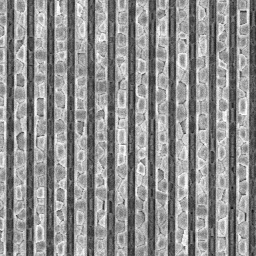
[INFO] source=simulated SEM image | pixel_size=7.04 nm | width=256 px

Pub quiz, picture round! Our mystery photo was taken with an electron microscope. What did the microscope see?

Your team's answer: parallel lines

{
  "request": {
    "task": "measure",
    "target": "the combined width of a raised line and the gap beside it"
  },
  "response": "142 nm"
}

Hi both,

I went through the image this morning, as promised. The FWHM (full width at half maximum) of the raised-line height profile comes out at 88.9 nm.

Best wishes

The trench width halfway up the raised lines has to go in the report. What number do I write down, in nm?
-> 53.7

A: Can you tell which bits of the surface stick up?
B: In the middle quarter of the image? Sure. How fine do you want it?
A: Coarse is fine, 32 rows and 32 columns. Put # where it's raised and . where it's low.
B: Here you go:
#..###..###..###..###..###..###.
#..###..###..###..###..###..###.
#..###..###..###..###..###..###.
#..###..###..###..###..###..###.
#..###..###..###..###..###..###.
#..###..###..###..###..###..###.
#..###..###..###..###..###..###.
#..###..###..###..###..###..###.
#..###..###..###..###..###..###.
#..###..###..###..###..###..#.#.
...###..###..###..###..###..###.
#..###..#.#..###..###..###..###.
#..###..##...###..###..###..###.
#..###..###..###..###..###..###.
#..###..###..###..###..###..###.
...###..###..###..###..###..#.#.
...###..###..###..###..###..###.
...###..###..###..###..###..###.
...###..###..###..###..###..###.
...###..###..###..###..###..###.
#..###..###..###..###..###..###.
#..###..###..###..###..###..###.
#..###..###..###..###..###..###.
#..###..###..###..###..###..###.
#..###..###..###..###..###..###.
#..###..###..###..###..###..###.
#..###..###..###..###..###..###.
#..###..###..###..###..###..###.
#..###..###..###..###..###..###.
#..###..###..###..###..###..###.
#..###..###..###..###..###..###.
#..###..###..###..###..###..###.